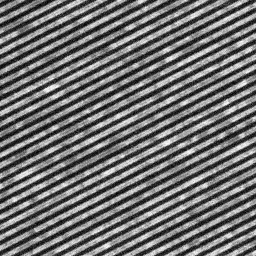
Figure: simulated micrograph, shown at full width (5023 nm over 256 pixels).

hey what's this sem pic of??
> parallel lines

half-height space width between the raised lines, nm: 116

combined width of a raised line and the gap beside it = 9.22 pixels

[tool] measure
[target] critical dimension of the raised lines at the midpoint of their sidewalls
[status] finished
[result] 0.0677 um